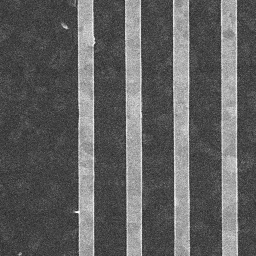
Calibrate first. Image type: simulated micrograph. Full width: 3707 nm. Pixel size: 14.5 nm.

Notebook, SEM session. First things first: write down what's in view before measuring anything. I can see parallel lines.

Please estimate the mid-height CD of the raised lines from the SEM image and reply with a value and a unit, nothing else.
214 nm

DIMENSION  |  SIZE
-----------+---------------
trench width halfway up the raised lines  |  478 nm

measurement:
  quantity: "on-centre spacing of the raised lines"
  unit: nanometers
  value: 691